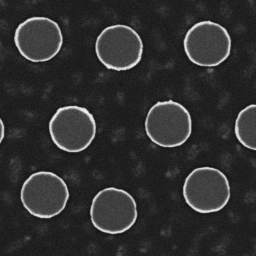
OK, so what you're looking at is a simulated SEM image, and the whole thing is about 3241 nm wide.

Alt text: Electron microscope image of a regular array of raised bodies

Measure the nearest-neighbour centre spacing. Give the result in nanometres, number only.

966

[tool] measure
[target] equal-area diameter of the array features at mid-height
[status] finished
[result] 569 nm